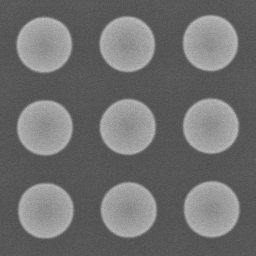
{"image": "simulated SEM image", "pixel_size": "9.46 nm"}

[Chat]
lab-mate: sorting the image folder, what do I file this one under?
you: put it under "an array of small figures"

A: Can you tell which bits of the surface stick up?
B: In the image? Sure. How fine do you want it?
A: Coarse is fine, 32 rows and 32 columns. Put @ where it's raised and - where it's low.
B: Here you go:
--------------------------------
--------------------------------
----@@@-------@@@-------@@@@----
---@@@@@-----@@@@@@----@@@@@@---
--@@@@@@@----@@@@@@----@@@@@@@--
--@@@@@@@---@@@@@@@----@@@@@@@--
--@@@@@@@----@@@@@@----@@@@@@@--
---@@@@@-----@@@@@@-----@@@@@---
----@@@-------@@@@-------@@@----
--------------------------------
--------------------------------
--------------------------------
---------------@@--------@@-----
---@@@@@------@@@@@-----@@@@@---
--@@@@@@@----@@@@@@----@@@@@@@--
--@@@@@@@----@@@@@@----@@@@@@@--
--@@@@@@@----@@@@@@----@@@@@@@--
---@@@@@@----@@@@@@----@@@@@@---
---@@@@@------@@@@------@@@@----
--------------------------------
--------------------------------
--------------------------------
--------------------------------
----@@@@------@@@@------@@@@@---
---@@@@@@----@@@@@@----@@@@@@---
--@@@@@@@----@@@@@@----@@@@@@@--
--@@@@@@@----@@@@@@----@@@@@@@--
--@@@@@@@----@@@@@@----@@@@@@@--
---@@@@@------@@@@@-----@@@@@---
----@@@--------@@--------@@@----
--------------------------------
--------------------------------